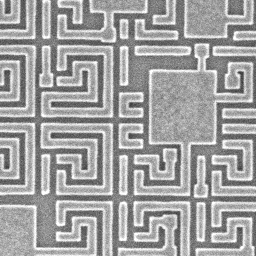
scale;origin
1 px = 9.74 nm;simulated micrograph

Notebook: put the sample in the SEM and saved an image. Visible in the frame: wiring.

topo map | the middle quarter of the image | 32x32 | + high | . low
..++++++..++..++................
..++++++..++..++................
..++..++..++..++......++++++++++
++++..++..++..++......++++++++++
++++..++..++..++......++++++++++
......++..++..........++++++++++
......++..++..........++++++++++
++++++++..++..++++++..++++++++++
++++++++..++..++++++..++++++++++
..........++..++......++++++++++
..........++..++......++++++++++
++++++++++++..++++++..++++++++++
++++++++++++..++++++..++++++++++
......................++++++++++
......................++++++++++
++++++++++++..++++++..++++++++++
++++++++++++..++++++..++++++++++
..........++..++......++++++++++
..........++..++......++++++++++
++++++++..++..++++++..++++++++++
++++++++..++..++++++.........+++
......++..++.............+++.++.
......++..++.............+++..+.
++++..++..++..++..++++++.+++..+.
++++..++..++..++..++++++.+++..+.
..++..++..++..++......++..++.++.
..++..++..++..+.......++.++..++.
..++++++..++..+...++..+++++..++.
..++++++..++..+...++..+++++..++.
..........++..+...++.........++.
+.........++..+...++.........++.
++++++++++++..+...+++++++++++++.